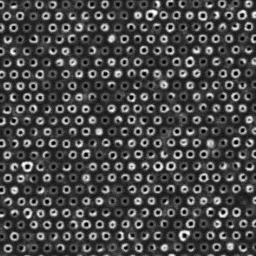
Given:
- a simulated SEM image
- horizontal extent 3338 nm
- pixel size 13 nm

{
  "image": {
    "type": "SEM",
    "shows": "a regular array of holes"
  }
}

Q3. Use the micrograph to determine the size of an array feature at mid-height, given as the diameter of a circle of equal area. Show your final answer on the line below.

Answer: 58.9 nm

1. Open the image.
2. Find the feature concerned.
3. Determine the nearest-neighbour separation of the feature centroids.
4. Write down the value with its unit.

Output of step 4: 165 nanometers